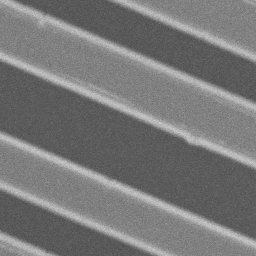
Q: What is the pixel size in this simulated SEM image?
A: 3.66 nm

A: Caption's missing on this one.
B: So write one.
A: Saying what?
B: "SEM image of one or a few lines or trenches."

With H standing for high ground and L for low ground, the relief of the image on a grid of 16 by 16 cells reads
HLLLLLLLLHHHHHHH
HHHHLLLLLLLHHHHH
HHHHHHLLLLLLLHHH
HHHHHHHHLLLLLLLL
LLHHHHHHHHHLLLLL
LLLLLHHHHHHHHLLL
LLLLLLLHHHHHHHHL
LLLLLLLLLHHHHHHH
LLLLLLLLLLLLHHHH
HHLLLLLLLLLLLLHH
HHHHHLLLLLLLLLLL
HHHHHHHLLLLLLLLL
LLHHHHHHHLLLLLLL
LLLLLHHHHHHHLLLL
LLLLLLLHHHHHHHLL
HHLLLLLLLHHHHHHH